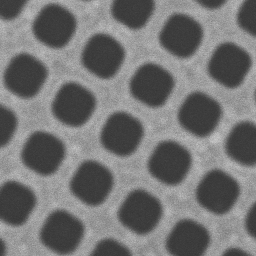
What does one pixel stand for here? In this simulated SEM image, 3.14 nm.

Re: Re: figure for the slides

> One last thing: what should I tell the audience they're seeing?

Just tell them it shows a regular array of holes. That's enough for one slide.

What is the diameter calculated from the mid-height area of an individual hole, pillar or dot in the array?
43.4 px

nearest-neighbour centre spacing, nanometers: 177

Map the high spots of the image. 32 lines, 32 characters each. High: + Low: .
...+++.+++++++.....++++++...++..
...++....+++++.....+++++++++++..
++++.....+++++....+++...++++++..
++++......++++++..++.....+++++..
++++.....+++..++++++.....+++++++
+++++...+++....+++++.....+++.+++
++++++++++......+++++...+++....+
+....+++++.....+++++++++++.....+
+.....+++++....++...++++++.....+
......++++++..+++.....++++.....+
+....+++..++++++......++++++..++
+....++....+++++.....+++.+++++++
+++++++.....+++++....++....+++++
.+++++......++++++++++......++++
..+++++....+++..++++++......++++
..++++++..+++.....++++.....+++..
..++..+++++++.....++++++..+++...
.++.....+++++.....++++++++++....
+++.....+++++....++....+++++....
+++.....+++++++.+++.....+++++...
+++.....++...+++++......++++++..
++++...++.....+++++.....++..++++
+++++++++.....++++++...++....+++
....+++++.....+++++++++++.....++
....+++++....+++...+++++......++
....+++++++..++.....+++++....+++
....+++.+++++++.....++++++..+++.
...+++....+++++.....+++.+++++++.
+++++......+++++...+++....+++++.
+++++.....+++++++++++.....+++++.
.++++.....++...++++++.....++++++
.++++++..+++....+++++.....++...+